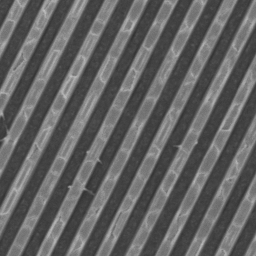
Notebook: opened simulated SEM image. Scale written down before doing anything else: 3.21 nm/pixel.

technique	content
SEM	parallel lines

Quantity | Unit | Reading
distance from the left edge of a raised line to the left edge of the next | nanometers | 85.4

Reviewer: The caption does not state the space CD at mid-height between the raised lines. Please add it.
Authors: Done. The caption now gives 0.0434 µm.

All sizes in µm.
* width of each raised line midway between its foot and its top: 0.0405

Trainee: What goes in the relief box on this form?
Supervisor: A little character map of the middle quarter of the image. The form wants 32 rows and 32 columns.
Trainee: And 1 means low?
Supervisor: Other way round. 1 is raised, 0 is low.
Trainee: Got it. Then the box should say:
00111000011110000111000011110000
01111000011100001111000011100001
01110000111100001110000111100001
11110000111000011110000111000011
11100001111000011100001111000011
11100001110000111100001110000111
11000011110000111000011110000111
11000011100001111000011100001111
10000111100001110000111100001110
10000111000011110000111000011110
00001111000011100001111000011100
00001110000111100001110000111100
00011110000111000011110000111000
00011100001111000011100001111000
00111100001110000111100001110000
00111000011110001111000011110000
01111000011100001111000011100001
01110000111100001110000111100001
11110000111000011110000111000011
11100001111000011100001111000011
11100001110000111100001110000111
11000011110000111000011110000111
11000011100001111000011100001111
10000111100001110000111100001110
10000111000011110000111000011110
00001111000011100001111000111100
00001110000111100001110000111100
00011110000111000011110001111000
00011100001111000011100001111000
00111100001110000111100011110000
00111000011110000111000011110001
01111000011100001111000111100001